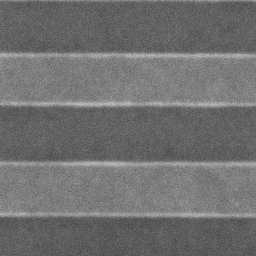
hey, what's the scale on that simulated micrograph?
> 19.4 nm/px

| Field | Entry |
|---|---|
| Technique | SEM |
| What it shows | lines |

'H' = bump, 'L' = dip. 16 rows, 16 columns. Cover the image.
LLLLLLLLLLLLLLLL
LLLLLLLLLLLLLLLL
LLLLLLLLLLLLLLLL
HHHHHHHHHHHHHHHL
HHHHHHHHHHHHHHHH
HHHHHHHHHHHHHHHH
LLHHHHHHHHHHHHHH
LLLLLLLLLLLLLLLL
LLLLLLLLLLLLLLLL
LLLLLLLLLLLLLLLL
HHHHHHHHHHHHHHHH
HHHHHHHHHHHHHHHH
HHHHHHHHHHHHHHHH
LLLLLLLLLLLLLLLL
LLLLLLLLLLLLLLLL
LLLLLLLLLLLLLLLL